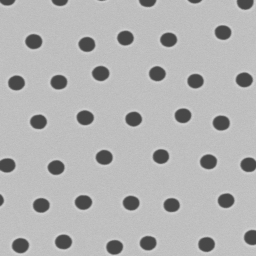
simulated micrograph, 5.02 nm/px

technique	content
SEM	a regular array of holes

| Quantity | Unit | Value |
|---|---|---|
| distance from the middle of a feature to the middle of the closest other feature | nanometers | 209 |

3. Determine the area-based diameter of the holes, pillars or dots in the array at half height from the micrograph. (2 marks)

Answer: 79.5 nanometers